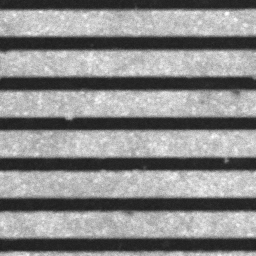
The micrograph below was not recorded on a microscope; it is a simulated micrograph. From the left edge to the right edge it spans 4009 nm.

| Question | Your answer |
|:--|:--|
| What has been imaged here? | parallel lines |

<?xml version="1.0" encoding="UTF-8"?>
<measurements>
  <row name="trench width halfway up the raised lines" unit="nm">405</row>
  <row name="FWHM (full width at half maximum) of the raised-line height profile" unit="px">14.4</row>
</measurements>